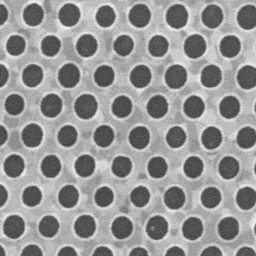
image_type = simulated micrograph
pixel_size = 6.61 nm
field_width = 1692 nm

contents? a regular array of holes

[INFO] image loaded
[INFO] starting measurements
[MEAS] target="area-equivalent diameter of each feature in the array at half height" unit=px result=24.2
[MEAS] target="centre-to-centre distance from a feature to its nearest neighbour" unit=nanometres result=229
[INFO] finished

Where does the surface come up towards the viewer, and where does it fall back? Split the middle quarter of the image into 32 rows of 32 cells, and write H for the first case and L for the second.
LLLHHHHHHLLLHHHHHHLLLHHHHHLLLLHH
LLLLHHHHLLLLLHHHHLLLLLHHHLLLLLLH
LLLLHHHLLLLLLHHHLLLLLLHHHLLLLLLH
LLLLHHHLLLLLLHHHLLLLLLHHHLLLLLLH
LLLLHHHHLLLLHHHHLLLLLLHHHLLLLLLH
LLLHHHHHLLLLHHHHHLLLLHHHHHLLLLHH
HHHHHHHHHHHHHHHHHHHHHHHHHHHLHHHH
HHHHLLLHHHHHHHLHHHHHHHHLHHHHHHHH
HHHLLLLLHHHHHLLLLHHHHLLLLHHHHHHL
HHHLLLLLHHHHLLLLLHHHHLLLLLHHHHLL
HHLLLLLLLHHHLLLLLHHHLLLLLLHHHLLL
HHLLLLLLHHHHLLLLLHHHHLLLLLHHHHLL
HHHLLLLLHHHHLLLLLHHHHLLLLLHHHHLL
HHHHLLLHHHHHHLLLHHHHHHLLLHHHHHHL
HHHHHHHHHHHHHHHHHHHHHHHHHHHHHHHH
LLHHHHHHLLLLHHHHHHLLHHHHHHHLLHHH
LLLHHHHHLLLLLHHHHLLLLHHHHHLLLLHH
LLLLHHHLLLLLLHHHLLLLLLHHHLLLLLLH
LLLLHHHLLLLLLHHHLLLLLLHHHLLLLLLH
LLLHHHHLLLLLHHHHLLLLLLHHHLLLLLHH
LLHHHHHHLLLLHHHHHLLLLHHHHHLLLLHH
HHHHHHHHHHHHHHHHHHHLHHHHHHHHHHHH
HHHHHLHHHHHHHHHHHHHHHHHHHHHHHHHH
HHHLLLLLHHHHLLLLHHHHHHLLLHHHHHHL
HHLLLLLLHHHHLLLLLHHHHLLLLLHHHHLL
HHLLLLLLHHHHLLLLLHHHHLLLLLHHHHLL
HHLLLLLLHHHHLLLLLHHHHLLLLLHHHLLL
HHHLLLLHHHHHLLLLLHHHHLLLLLHHHHLL
HHHHLLHHHHHHHHLHHHHHHHLLLHHHHHHL
HHHHHHHHHHHHHHHHHHHHHHHHHHHHHHHH
LLLHHHHHHLLHHHHHHHLLHHHHHHHLLHHH
LLLLHHHHLLLLHHHHHLLLLHHHHLLLLLHH